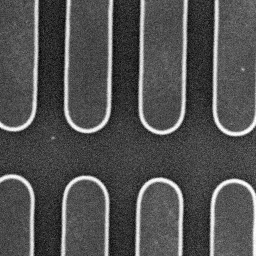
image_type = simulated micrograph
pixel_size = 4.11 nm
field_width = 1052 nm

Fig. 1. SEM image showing groups of lines, slits or small figures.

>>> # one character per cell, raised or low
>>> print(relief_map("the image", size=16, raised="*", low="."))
**..***..***..**
**..***..***..**
**..***..***.***
**..***..***.***
**..***..**..***
**..***..**..***
**..***..**..***
**..***..**...**
................
................
................
**..**...**...*.
**..***..**..***
**..***..**..***
**..***..**..***
**..***..**..***